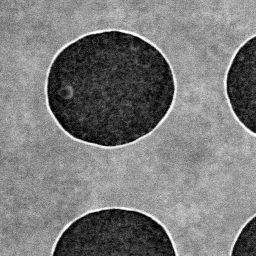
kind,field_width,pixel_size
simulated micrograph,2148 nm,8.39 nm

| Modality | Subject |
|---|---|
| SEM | holes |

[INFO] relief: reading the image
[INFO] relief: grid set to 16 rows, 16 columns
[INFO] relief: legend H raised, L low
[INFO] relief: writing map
HHHHHHHHHHHHHHHH
HHHHHHHHHHHHHHHH
HHHHHLLLLHHHHHHH
HHHHLLLLLLHHHHHL
HHHLLLLLLLLHHHLL
HHHLLLLLLLLHHHLL
HHHLLLLLLLLHHHLL
HHHHLLLLLLHHHHHL
HHHHHLLLLHHHHHHH
HHHHHHHHHHHHHHHH
HHHHHHHHHHHHHHHH
HHHHHHHHHHHHHHHH
HHHHHHHHHHHHHHHH
HHHHHLLLLHHHHHHH
HHHHLLLLLLHHHHHL
HHHLLLLLLLLHHHHL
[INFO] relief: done